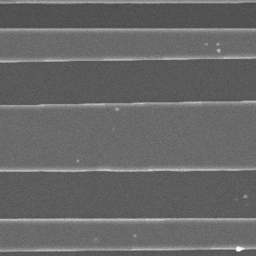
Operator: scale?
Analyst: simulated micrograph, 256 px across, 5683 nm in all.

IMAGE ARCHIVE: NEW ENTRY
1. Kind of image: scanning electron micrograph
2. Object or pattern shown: lines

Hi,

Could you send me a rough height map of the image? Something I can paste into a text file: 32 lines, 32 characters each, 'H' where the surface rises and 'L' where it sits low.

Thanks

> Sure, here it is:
LLLLLLLLLLLLLLLLLLLLLLLLLLLLLLLL
LLLLLLLLLLLLLLLLLLLLLLLLLLLLLLLL
LLLLLLLLLLLLLLLLLLLLLLLLLLLLLLLL
LLLLLLLLLLLLLLLLLLLLLLLLLLLLLLLL
HHHHHHHHHHHHHHHHHHHHHHHHHHHHHHHH
HHHHHHHHHHHHHHHHHHHHHHHHHHHHHHHH
HHHHHHHHHHHHHHHHHHHHHHHHHHHHHHHH
HHHHHHHHHHHHHHLLLLLLLLLLLLLLLLLL
LLLLLLLLLLLLLLLLLLLLLLLLLLLLLLLL
LLLLLLLLLLLLLLLLLLLLLLLLLLLLLLLL
LLLLLLLLLLLLLLLLLLLLLLLLLLLLLLLL
LLLLLLLLLLLLLLLLLLLLLLLLLLLLLLLL
LLLLLLLLLLLLLLLLLLLLLLLLLLLLLLLL
HHHHHHHHHHHHHHHHHHHHHHHHHHHHHHHH
HHHHHHHHHHHHHHHHHHHHHHHHHHHHHHHH
HHHHHHHHHHHHHHHHHHHHHHHHHHHHHHHH
HHHHHHHHHHHHHHHHHHHHHHHHHHHHHHHH
HHHHHHHHHHHHHHHHHHHHHHHHHHHHHHHH
HHHHHHHHHHHHHHHHHHHHHHHHHHHHHHHH
HHHHHHHHHHHHHHHHHHHHHHHHHHHHHHHH
HHHHHHHHHHHHHHHHHHHHHHHHHHHHHHHH
LLLLLLLLLLLLLLLLLLLLLLLLLLLLLLLL
LLLLLLLLLLLLLLLLLLLLLLLLLLLLLLLL
LLLLLLLLLLLLLLLLLLLLLLLLLLLLLLLL
LLLLLLLLLLLLLLLLLLLLLLLLLLLLLLLL
LLLLLLLLLLLLLLLLLLLLLLLLLLLLLLLL
LLLLLLLLLLLLLLLLLLLLLLLLLLLLLLLL
LLLLLLLLLLLLLLLHLHHHHHHHHHHHHHHH
HHHHHHHHHHHHHHHHHHHHHHHHHHHHHHHH
HHHHHHHHHHHHHHHHHHHHHHHHHHHHHHHH
HHHHHHHHHHHHHHHHHHHHHHHHHHHHHHHH
LLLLLLLLLLLLLLLLLLLLLLLLLLLLLLLL